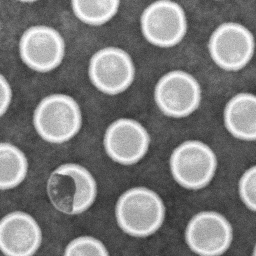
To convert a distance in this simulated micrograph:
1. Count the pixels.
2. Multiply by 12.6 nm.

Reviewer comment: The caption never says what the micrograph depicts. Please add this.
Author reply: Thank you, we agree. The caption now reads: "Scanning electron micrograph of a regular array of raised bodies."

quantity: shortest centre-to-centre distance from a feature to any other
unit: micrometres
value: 0.884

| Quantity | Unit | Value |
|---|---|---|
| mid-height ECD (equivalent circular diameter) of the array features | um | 0.525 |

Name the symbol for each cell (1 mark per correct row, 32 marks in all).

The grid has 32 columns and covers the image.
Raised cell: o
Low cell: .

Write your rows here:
.........oooooo.....o...........
..........oooo....ooooo.........
...........oo.....ooooo.........
..................ooooo.....oo..
...oooo...........ooooo....oooo.
...ooooo............o.....ooooo.
...ooooo.....oo............oooo.
...oooo.....oooo...........oooo.
.....o.....ooooo................
...........ooooo.....oo.........
o...........oooo....oooo........
o...................ooooo.......
o.....ooo...........ooooo....ooo
o....ooooo..........oooo.....ooo
.....ooooo..................oooo
.....ooooo....ooo...........oooo
.....oooo.....oooo...........ooo
......oo.....ooooo..............
oo...........ooooo.....ooo......
ooo...........oooo....ooooo.....
ooo...................ooooo.....
ooo.....ooo...........ooooo....o
oo.......oo...........oooo....oo
..........oo..................oo
.........ooo....ooo...........oo
.........oo....ooooo...........o
...............ooooo............
.ooo...........ooooo....oooo....
ooooo...........ooo.....ooooo...
ooooo..................oooooo...
ooooo....ooo............oooo....
.ooo....ooooo............ooo....